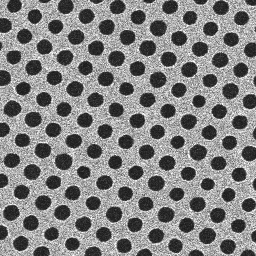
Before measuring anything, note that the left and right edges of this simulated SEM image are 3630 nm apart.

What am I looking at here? a regular array of holes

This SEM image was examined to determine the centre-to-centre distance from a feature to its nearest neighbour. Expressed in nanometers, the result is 324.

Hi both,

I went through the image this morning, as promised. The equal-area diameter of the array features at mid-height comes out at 212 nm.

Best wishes